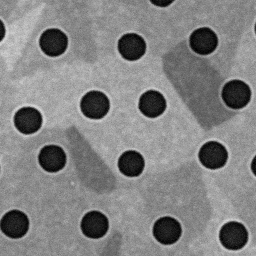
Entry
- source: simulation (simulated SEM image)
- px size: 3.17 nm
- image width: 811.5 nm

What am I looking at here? a regular array of holes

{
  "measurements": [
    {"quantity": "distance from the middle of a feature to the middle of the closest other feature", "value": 197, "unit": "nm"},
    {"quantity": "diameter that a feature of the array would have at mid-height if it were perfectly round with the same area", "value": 96.4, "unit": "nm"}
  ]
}